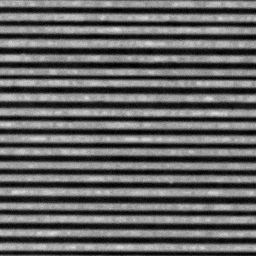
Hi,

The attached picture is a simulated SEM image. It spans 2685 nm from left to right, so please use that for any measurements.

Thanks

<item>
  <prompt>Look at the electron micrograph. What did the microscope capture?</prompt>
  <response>parallel lines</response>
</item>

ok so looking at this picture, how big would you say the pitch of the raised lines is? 0.142 µm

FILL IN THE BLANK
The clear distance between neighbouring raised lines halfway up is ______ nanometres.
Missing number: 73.4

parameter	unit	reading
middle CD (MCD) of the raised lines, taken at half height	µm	0.0642